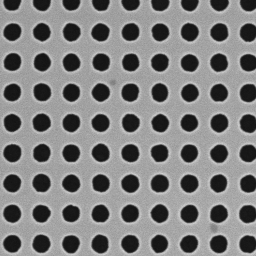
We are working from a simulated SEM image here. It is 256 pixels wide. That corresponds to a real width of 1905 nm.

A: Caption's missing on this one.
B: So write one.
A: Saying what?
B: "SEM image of a regular array of holes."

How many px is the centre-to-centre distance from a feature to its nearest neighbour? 29.2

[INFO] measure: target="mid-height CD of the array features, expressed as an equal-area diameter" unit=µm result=0.133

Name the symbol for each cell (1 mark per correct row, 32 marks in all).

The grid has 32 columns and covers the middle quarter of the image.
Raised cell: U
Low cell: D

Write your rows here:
DDDDUUUDDDDUUUUDDDDUUUDDDDUUUDDD
UDDUUUUUDDDUUUUDDDUUUUUDDUUUUUDD
UUUUUUUUUUUUUUUUUUUUUUUUUUUUUUUU
UUUUUUUUUUUUUUUUUUUUUUUUUUUUUUUU
UUUUUUUUUUUUUUUUUUUUUUUUUUUUUUUU
DDDUUUUUDDDUUUUDDDUUUUUDDUUUUUDD
DDDDUUUDDDDUUUDDDDDUUUDDDDUUUDDD
DDDDUUUDDDDDUUDDDDDUUUDDDDUUUDDD
DDDUUUUDDDDUUUUDDDUUUUDDDDUUUUDD
UUUUUUUUUUUUUUUUDUUUUUUUUUUUUUUD
UUUUUUUUUUUUUUUUUUUUUUUUUUUUUUUU
UUUUUUUUUUUUUUUUUUUUUUUUUUUUUUUU
UDUUUUUUUUUUUUUUDUUUUUUUUUUUUUUD
DDDDUUUDDDDUUUUDDDUUUUDDDDUUUUDD
DDDDUUUDDDDUUUDDDDDUUUDDDDUUUDDD
DDDDUUUDDDDUUUUDDDDUUUDDDDUUUDDD
DDDUUUUUDDDUUUUDDDUUUUUDDUUUUUDD
UUUUUUUUUUUUUUUUUUUUUUUUUUUUUUUU
UUUUUUUUUUUUUUUUUUUUUUUUUUUUUUUU
UUUUUUUUUUUUUUUUUUUUUUUUUUUUUUUU
DDDUUUUUDDDUUUUDDDUUUUUDDUUUUUDD
DDDDUUUDDDDUUUUDDDDUUUDDDDUUUDDD
DDDDUUUDDDDUUUDDDDDUUUDDDDUUUDDD
DDDDUUUDDDDUUUUDDDDUUUDDDDUUUUDD
UDUUUUUUUUUUUUUUDUUUUUUDDUUUUUDD
UUUUUUUUUUUUUUUUUUUUUUUUUUUUUUUU
UUUUUUUUUUUUUUUUUUUUUUUUUUUUUUUU
UUUUUUUUUUUUUUUUUUUUUUUUUUUUUUUU
DDDDUUUDDDDUUUUDDDUUUUDDDDUUUUDD
DDDDUUUDDDDUUUDDDDDUUUDDDDUUUDDD
DDDDUUUDDDDUUUUDDDDUUUDDDDUUUDDD
DDDUUUUUDDDUUUUDDDUUUUDDDUUUUUDD